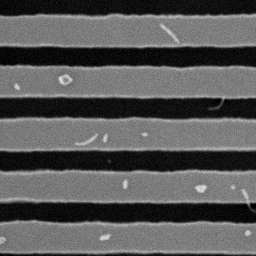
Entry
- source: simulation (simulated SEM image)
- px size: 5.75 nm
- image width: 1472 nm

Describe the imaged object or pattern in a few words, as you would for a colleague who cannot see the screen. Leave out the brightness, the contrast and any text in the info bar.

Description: lines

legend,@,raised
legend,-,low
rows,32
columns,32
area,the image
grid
--------------------------------
--------------------------------
@@@@@@@@@@@@@@@@@@@@@@@@@@@@@@@@
@@@@@@@@@@@@@@@@@@@@@@@@@@@@@@@@
@@@@@@@@@@@@@@@@@@@@@@@@@@@@@@@@
@@@@@@@@@@@@@@@@@@@@@@@@@@@@@@@@
--------------------------------
--------------------------------
@@@@@@@@@@@@@@@@@@@@@@@@@@@@@@@@
@@@@@@@@@@@@@@@@@@@@@@@@@@@@@@@@
@@@@@@@@@@@@@@@@@@@@@@@@@@@@@@@@
@@@@@@@@@@@@@@@@@@@@@@@@@@@@@@@@
--------------------------------
--------------------------------
--------------------------------
@@@@@@@@@@@@@@@@@@@@@@@@@@@@@@@@
@@@@@@@@@@@@@@@@@@@@@@@@@@@@@@@@
@@@@@@@@@@@@@@@@@@@@@@@@@@@@@@@@
@@@@@@@@@@@@@@@@@@@@@@@@@@@@@@@@
--------------------------------
--------------------------------
@@@-@@@@@@@@@@@-@@@--@@@@@@@@@@@
@@@@@@@@@@@@@@@@@@@@@@@@@@@@@@@@
@@@@@@@@@@@@@@@@@@@@@@@@@@@@@@@@
@@@@@@@@@@@@@@@@@@@@@@@@@@@@@@@@
--------------------------------
--------------------------------
--------------------------------
@@@@@@@@@@@@@@@@@@@@@@@@@@@@@@@@
@@@@@@@@@@@@@@@@@@@@@@@@@@@@@@@@
@@@@@@@@@@@@@@@@@@@@@@@@@@@@@@@@
@@@@@@@@@@@@@@@@@@@@@@@@@@@@@@@@